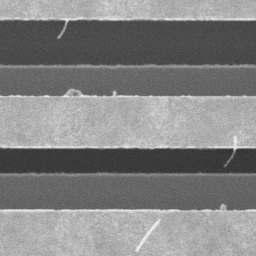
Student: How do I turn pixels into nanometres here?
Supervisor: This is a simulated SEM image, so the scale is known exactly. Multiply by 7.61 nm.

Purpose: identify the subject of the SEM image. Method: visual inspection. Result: lines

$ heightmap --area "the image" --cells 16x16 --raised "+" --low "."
++++++++++++++++
................
................
................
++++++++++++++++
++++++++++++++++
++++++++++++++++
++++++++++++++++
++++++++++++++++
................
................
++++++++++++++++
++++++++++++++++
++++++++++++++++
++++++++++++++++
++++++++++++++++